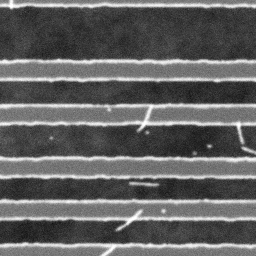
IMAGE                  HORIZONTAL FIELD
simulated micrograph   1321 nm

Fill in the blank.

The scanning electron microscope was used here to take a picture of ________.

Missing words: lines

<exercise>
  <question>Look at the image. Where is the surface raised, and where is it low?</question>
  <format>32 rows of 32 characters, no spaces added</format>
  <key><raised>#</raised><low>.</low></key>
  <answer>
################################
................................
................................
................................
................................
................................
................................
................................
################################
################################
................................
................................
................................
################################
################################
##.#..##...#####.####...########
................................
................................
................................
................................
################################
################################
................................
................................
................................
################################
################################
................#...........##..
................................
................................
...#............................
################################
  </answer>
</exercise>